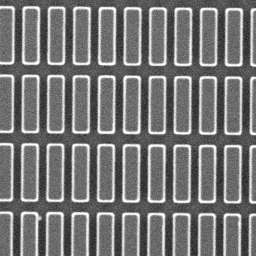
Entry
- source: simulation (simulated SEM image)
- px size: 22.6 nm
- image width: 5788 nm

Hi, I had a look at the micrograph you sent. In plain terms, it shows groups of lines, slits or small figures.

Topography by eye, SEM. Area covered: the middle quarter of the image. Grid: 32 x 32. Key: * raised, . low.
................................
................................
................................
...***...***....***...***...***.
..****...****..****..****...****
..****...****..****..****...****
..****...****..****..****...****
..****...****..****..****...****
..****...****..****..****...****
..****...****..****..****...****
..****...****..****..****...****
..****...****..****..****...****
..****...****..****..****...****
..****...****..****..****...****
..****...****..****..****...****
..****...****..****..****...****
..****...****..****..****...****
................................
................................
................................
...***...***...***....***...**..
..****...***...****..****...***.
..****...***...****..****...***.
..****...***...****..****...***.
..****...***...****..****...***.
..****...***...****..****...***.
..****...***...****..****...***.
..****...***...****..****...***.
..****...***...****..****...***.
..****...***...****..****...***.
..****...***...****..****...***.
..****...***...****..****...***.